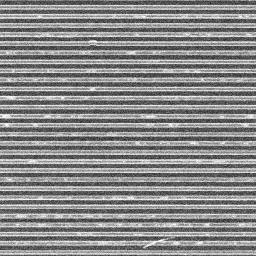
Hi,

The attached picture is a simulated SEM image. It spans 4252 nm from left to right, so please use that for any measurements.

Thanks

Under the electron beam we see parallel lines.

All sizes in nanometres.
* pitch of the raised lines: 151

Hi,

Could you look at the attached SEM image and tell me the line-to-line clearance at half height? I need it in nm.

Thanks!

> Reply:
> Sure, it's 91.4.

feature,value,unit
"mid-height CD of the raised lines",66.4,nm